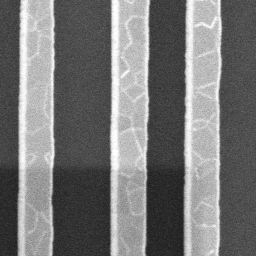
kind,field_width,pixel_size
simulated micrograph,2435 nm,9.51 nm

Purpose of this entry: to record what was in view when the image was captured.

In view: lines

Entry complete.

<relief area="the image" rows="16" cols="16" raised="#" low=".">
.##....##...##..
.##....##...##..
.##....##...##..
.##....##...##..
.##....##...##..
.##....##...##..
.##....##...##..
.##....##...##..
.##....##...##..
.##....##...##..
.##....##...##..
.##....##...##..
.##....##...##..
.##....##...##..
.##....##...##..
.##....##...##..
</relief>